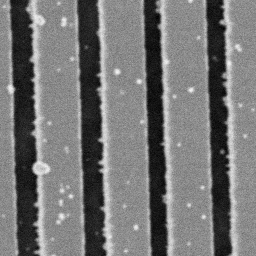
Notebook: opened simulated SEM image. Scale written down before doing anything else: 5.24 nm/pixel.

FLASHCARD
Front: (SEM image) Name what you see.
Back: lines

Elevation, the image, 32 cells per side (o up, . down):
o...oooooo..oooooo..oooooo..oooo
o...oooooo..oooooo..oooooo..oooo
o...oooooo..oooooo..oooooo..oooo
o...oooooo..oooooo..oooooo..oooo
o...oooooo..oooooo..oooooo..oooo
o...oooooo...ooooo..oooooo..oooo
o...oooooo...ooooo..oooooo..oooo
o...oooooo...ooooo..oooooo..oooo
o...oooooo...ooooo..oooooo..oooo
o...oooooo...ooooo..oooooo..oooo
o...oooooo...ooooo..oooooo..oooo
oo..oooooo...ooooo...ooooo..oooo
oo..oooooo...ooooo..oooooo..oooo
oo..oooooo...ooooo...ooooo..oooo
oo...ooooo...ooooo...ooooo...ooo
oo..oooooo...ooooo...ooooo...ooo
oo...ooooo...ooooo...ooooo...ooo
oo...ooooo...ooooo...ooooo...ooo
oo...ooooo...ooooo...ooooo...ooo
oo...ooooo...ooooo...ooooo...ooo
oo..oooooo...ooooo...ooooo...ooo
oo..oooooo...ooooo...ooooo...ooo
oo...ooooo...oooooo..ooooo...ooo
oo...ooooo...oooooo..ooooo...ooo
oo...ooooo...oooooo..ooooo...ooo
oo...ooooo...oooooo..ooooo...ooo
oo...ooooo...oooooo..ooooo...ooo
oo...ooooo...oooooo..oooooo..ooo
oo...ooooo...oooooo..oooooo..ooo
oo...oooooo..oooooo..oooooo..ooo
oo...oooooo..oooooo..oooooo..ooo
oo...oooooo..oooooo..oooooo..ooo